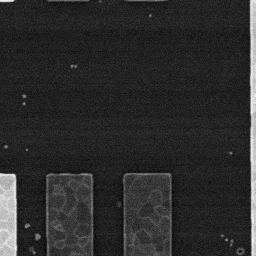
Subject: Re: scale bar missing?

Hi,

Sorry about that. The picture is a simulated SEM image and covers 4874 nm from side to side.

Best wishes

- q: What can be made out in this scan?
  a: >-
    wiring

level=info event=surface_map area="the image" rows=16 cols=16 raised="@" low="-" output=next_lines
----------------
----------------
----------------
----------------
----------------
----------------
----------------
----------------
----------------
----------------
----------------
@--@@@--@@@-----
@--@@@--@@@-----
@--@@@--@@@-----
@--@@@--@@@-----
@--@@@--@@@-----